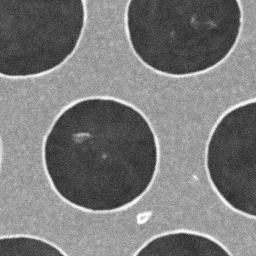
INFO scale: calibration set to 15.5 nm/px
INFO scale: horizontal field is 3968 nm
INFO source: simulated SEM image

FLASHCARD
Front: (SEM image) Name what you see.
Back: holes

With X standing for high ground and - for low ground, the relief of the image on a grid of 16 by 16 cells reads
-----XXX-------X
-----XXX-------X
-----XXX-------X
----XXXXX-----XX
---XXXXXXX--XXXX
XXXXXXXXXXXXXXXX
XXXXX---XXXXXXX-
XXXX-----XXXXX--
XXX-------XXX---
XXX-------XXX---
XXX-------XXX---
XXX------XXXX---
XXXX----XXXXXX--
XXXXXXXXXXXXXXXX
XXXXXXXXXXXXXXXX
---XXXXXX-----XX